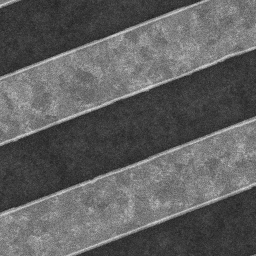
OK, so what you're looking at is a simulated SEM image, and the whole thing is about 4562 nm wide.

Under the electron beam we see one or a few lines or trenches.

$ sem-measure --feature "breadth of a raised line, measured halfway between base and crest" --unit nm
1080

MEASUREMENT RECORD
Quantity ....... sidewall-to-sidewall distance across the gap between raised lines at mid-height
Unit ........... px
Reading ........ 68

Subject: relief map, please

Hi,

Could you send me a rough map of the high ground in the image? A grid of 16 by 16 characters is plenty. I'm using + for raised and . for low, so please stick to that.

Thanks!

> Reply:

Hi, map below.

............++++
.........+++++++
......++++++++++
....++++++++++..
.+++++++++++....
+++++++++.......
+++++++.........
++++............
+............+++
...........+++++
........++++++++
.....+++++++++++
...++++++++++...
+++++++++++.....
++++++++........
+++++...........